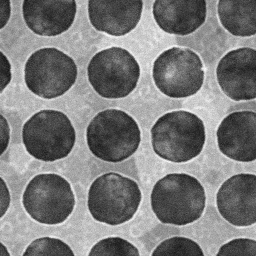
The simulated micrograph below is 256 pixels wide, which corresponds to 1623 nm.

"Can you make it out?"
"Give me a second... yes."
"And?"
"a regular array of holes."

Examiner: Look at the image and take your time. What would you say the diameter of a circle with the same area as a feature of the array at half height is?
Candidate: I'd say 337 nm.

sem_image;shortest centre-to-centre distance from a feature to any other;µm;0.399